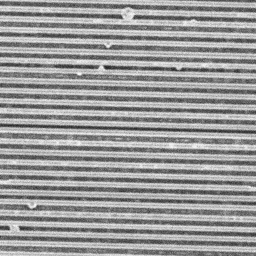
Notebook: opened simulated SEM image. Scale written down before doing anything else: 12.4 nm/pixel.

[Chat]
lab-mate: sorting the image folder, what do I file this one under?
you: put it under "parallel lines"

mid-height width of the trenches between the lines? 68.1 nm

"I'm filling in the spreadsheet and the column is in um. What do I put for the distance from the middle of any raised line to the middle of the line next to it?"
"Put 0.126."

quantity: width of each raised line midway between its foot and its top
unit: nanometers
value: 55.7